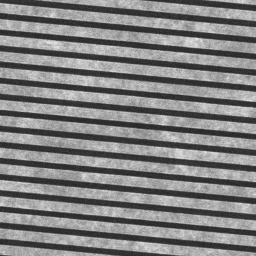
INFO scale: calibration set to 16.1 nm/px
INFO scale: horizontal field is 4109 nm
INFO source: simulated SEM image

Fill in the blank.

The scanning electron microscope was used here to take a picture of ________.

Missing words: parallel lines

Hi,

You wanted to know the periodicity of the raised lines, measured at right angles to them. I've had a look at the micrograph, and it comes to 257 nm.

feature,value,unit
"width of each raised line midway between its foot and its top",163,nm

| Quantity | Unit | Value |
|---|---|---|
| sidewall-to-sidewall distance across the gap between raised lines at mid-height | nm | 91.8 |